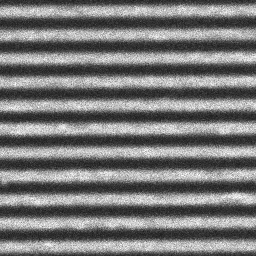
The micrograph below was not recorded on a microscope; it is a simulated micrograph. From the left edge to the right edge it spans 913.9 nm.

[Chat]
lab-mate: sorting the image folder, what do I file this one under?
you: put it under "parallel lines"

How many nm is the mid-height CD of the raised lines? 38.8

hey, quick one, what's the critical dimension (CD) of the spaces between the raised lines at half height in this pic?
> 11.9 px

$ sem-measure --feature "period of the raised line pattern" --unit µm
0.0839